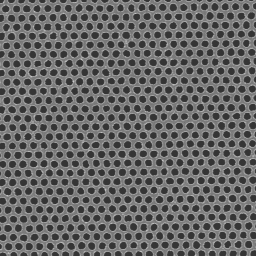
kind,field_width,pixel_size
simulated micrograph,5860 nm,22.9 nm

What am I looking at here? a regular array of holes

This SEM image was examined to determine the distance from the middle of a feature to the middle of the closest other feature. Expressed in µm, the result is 0.229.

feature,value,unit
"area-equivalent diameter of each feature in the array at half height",163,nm